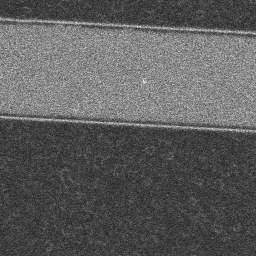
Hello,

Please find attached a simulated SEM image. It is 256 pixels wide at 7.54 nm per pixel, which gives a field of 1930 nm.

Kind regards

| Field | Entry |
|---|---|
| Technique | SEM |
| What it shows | one or a few lines or trenches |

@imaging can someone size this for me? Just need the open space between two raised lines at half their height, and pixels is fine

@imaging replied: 97.2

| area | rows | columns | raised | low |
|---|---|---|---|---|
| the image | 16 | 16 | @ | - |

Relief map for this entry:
@@@@@@@@@@@@@@@@
-----@@@@@@@@@@@
----------------
----------------
----------------
----------------
----------------
@@@@------------
@@@@@@@@@@@@@@@@
@@@@@@@@@@@@@@@@
@@@@@@@@@@@@@@@@
@@@@@@@@@@@@@@@@
@@@@@@@@@@@@@@@@
@@@@@@@@@@@@@@@@
@@@@@@@@@@@@@@@@
@@@@@@@@@@@@@@@@